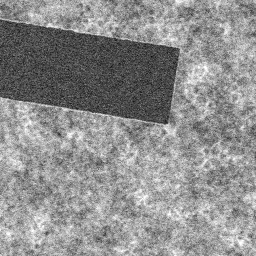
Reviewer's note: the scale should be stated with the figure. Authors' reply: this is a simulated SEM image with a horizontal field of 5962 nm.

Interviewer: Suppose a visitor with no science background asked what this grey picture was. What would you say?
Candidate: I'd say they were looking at one or a few lines or trenches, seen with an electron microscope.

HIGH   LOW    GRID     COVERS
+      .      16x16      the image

................
++..............
++++++++........
+++++++++++.....
+++++++++++.....
+++++++++++.....
..+++++++++.....
........++......
................
................
................
................
................
................
................
................